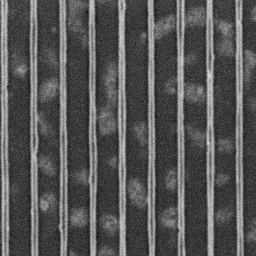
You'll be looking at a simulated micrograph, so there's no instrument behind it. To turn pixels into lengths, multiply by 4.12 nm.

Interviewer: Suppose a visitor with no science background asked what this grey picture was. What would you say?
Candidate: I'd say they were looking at parallel lines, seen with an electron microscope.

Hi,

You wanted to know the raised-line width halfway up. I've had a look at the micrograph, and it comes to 0.0185 µm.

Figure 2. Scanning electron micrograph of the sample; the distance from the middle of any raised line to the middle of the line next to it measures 29.4 pixels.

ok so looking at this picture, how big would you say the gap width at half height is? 0.104 µm